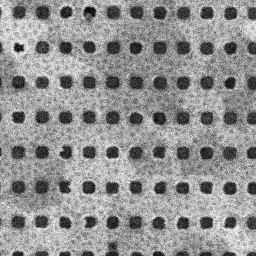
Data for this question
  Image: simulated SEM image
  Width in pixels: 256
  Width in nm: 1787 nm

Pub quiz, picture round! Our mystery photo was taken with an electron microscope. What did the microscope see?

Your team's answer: a regular array of holes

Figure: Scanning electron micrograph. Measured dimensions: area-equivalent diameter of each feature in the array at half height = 0.0984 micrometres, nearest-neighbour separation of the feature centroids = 0.162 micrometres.